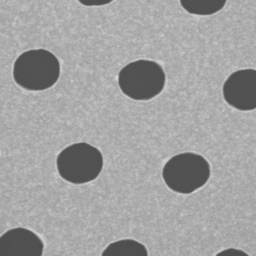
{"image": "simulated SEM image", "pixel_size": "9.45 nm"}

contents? holes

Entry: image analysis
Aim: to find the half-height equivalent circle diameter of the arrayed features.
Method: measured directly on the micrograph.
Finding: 415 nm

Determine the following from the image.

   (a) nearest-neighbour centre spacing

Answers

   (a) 103 pixels